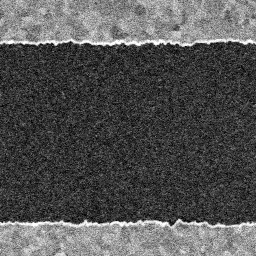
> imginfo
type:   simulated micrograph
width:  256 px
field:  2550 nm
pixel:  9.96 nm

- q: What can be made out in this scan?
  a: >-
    one or a few lines or trenches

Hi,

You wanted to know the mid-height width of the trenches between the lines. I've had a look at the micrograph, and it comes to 1800 nm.